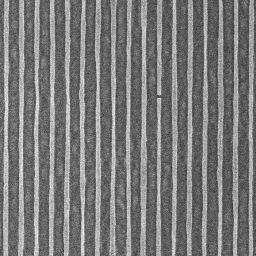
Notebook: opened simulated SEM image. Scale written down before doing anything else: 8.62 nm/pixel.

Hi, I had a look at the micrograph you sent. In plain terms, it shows parallel lines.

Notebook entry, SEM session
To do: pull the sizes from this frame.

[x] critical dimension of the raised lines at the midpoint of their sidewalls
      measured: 0.0367 microns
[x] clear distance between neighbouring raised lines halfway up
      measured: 11.3 px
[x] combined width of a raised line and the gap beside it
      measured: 132 nm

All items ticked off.